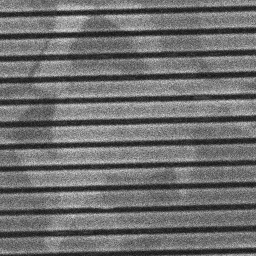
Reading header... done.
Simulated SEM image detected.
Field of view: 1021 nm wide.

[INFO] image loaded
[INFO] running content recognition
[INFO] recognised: parallel lines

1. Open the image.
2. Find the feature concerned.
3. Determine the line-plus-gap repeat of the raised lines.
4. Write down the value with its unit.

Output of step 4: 22 pixels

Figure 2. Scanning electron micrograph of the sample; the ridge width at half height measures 59.3 nanometers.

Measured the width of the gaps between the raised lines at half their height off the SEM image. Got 27.9 nanometers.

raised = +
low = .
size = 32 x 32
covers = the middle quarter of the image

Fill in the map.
++++++++++++++++++++++++++++++++
++++++++++++++++++++++++++++++++
+++++++++.......................
................................
.........+++++++++++++++++++++++
++++++++++++++++++++++++++++++++
++++++++++++++++++++++++++++++++
+++++++++++++++++++++++++++++...
................................
................................
++++++++++++++++++++++++++++++++
++++++++++++++++++++++++++++++++
++++++++++++++++++++++++++++++++
+++++++++++++++.................
................................
..............++++++++++++++++++
++++++++++++++++++++++++++++++++
++++++++++++++++++++++++++++++++
++++++++++++++++++++++++++++++++
................................
................................
++++++++++++++++++++++++++++++++
++++++++++++++++++++++++++++++++
++++++++++++++++++++++++++++++++
++++++++++++....................
................................
...........+++++++++++++++++++++
++++++++++++++++++++++++++++++++
++++++++++++++++++++++++++++++++
++++++++++++++++++++++++++++++..
................................
..............................++